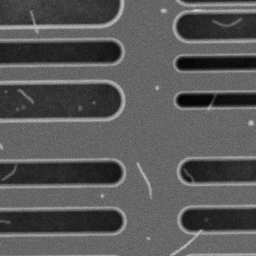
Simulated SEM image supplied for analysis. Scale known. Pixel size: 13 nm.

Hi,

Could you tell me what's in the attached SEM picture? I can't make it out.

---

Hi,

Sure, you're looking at groups of lines, slits or small figures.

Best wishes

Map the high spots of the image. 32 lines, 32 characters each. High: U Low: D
DDDDDDDDDDDDDDDUUUUUUUUUDDDDUUUU
DDDDDDDDDDDDDDDUUUUUUUUUUUUUUDDD
DDDDDDDDDDDDDDUUUUUUUUDDDDDDDDDD
UUUUUUUUUUUUUUUUUUUUUUDDDDDDDDDD
UUUUUUUUUUUUUUUUUUUUUUDDDDDDDDDD
DDDDDDDDDDDDDDDUUUUUUUUUUUUUUUUU
DDDDDDDDDDDDDDDUUUUUUUUUUUUUUUUU
DDDDDDDDDDDDDDDUUUUUUUDDDDDDDDDD
UUUUUUUUUUUUUUUUUUUUUUDDDDDDDDDD
UUUUUUUUUUUUUUUUUUUUUUUUUUUUUUUU
DDDDDDDDDDDDDDUUUUUUUUUUUUUUUUUU
DDDDDDDDDDDDDDDUUUUUUUUUUUUUUUUU
DDDDDDDDDDDDDDDUUUUUUUDDDDDDDDDD
DDDDDDDDDDDDDDDUUUUUUUUUUUUUUUUU
DDDDDDDDDDDDDDUUUUUUUUUUUUUUUUUU
UUUUUUUUUUUUUUUUUUUUUUUUUUUUUUUU
UUUUUUUUUUUUUUUUUUUUUUUUUUUUUUUU
UUUUUUUUUUUUUUUUUUUUUUUUUUUUUUUU
UUUUUUUUUUUUUUUUUUUUUUUUUUUUUUUU
UUUUUUUUUUUUUUUUUUUUUUUUUUUUUUUU
DDDDDDDDDDDDDDDUUUUUUUUDDDDDDDDD
DDDDDDDDDDDDDDDUUUUUUUDDDDDDDDDD
DDDDDDDDDDDDDDDUUUUUUUUDDDDDDDDD
UUUUUUUUUUUUUUUUUUUUUUUUUUUUUUUU
UUUUUUUUUUUUUUUUUUUUUUUUUUUUUUUU
UUUUUUUUUUUUUUUUUUUUUUUUUUUUUUUU
DDDDDDDDDDDDDDDUUUUUUUUDDDDDDDDD
DDDDDDDDDDDDDDDUUUUUUUUDDDDDDDDD
DDDDDDDDDDDDDDDUUUUUUUUDDDDDDDDD
UUUUUUUUUUUUUUUUUUUUUUUUUUUUUUUU
UUUUUUUUUUUUUUUUUUUUUUUUUUUUUUUU
UUUUUUUUUUUUUUUUUUUUUUUUUUUUUUUU